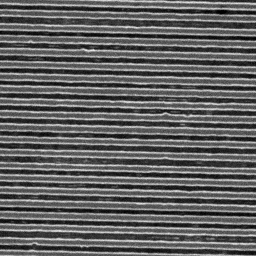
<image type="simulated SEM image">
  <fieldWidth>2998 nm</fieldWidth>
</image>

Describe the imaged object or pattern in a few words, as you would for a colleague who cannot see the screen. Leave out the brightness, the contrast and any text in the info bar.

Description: parallel lines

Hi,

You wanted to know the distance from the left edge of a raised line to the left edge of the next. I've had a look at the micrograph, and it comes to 0.148 microns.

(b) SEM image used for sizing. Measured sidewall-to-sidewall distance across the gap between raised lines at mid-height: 5.75 px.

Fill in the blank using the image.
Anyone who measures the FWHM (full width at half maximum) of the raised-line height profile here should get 77.5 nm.